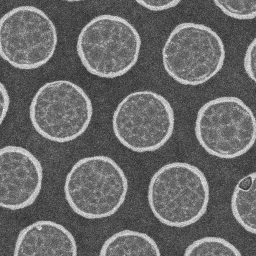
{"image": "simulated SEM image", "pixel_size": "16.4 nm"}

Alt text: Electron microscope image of raised bodies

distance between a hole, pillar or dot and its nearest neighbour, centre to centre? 1320 nm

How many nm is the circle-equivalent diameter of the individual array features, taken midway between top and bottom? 957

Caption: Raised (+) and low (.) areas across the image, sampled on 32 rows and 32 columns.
..................+++......+++++
..+++.......................++++
++++++......+++.................
+++++++....+++++.......+++......
+++++++...+++++++....++++++.....
+++++++...+++++++....+++++++....
+++++++...+++++++....+++++++...+
.+++++....+++++++....+++++++...+
...........+++++.....++++++....+
......................++++.....+
......+++.......................
+....+++++......................
+...+++++++.....++++........+...
+...+++++++....++++++.....+++++.
....+++++++...+++++++....++++++.
....+++++++...+++++++....+++++++
.....+++++....+++++++....+++++++
...............++++++....+++++++
.................++.......+++++.
++++........................+...
+++++.....++++..................
+++++....++++++.....+++++.......
+++++....+++++++...++++++......+
+++++...++++++++...+++++++.....+
++++....+++++++....+++++++...+++
+++......++++++....+++++++...+++
..........++++.....++++++....+++
....................++++......++
....++++.......................+
...++++++......+++..............
..+++++++....++++++.....++++....
..+++++++....+++++++...+++++++..